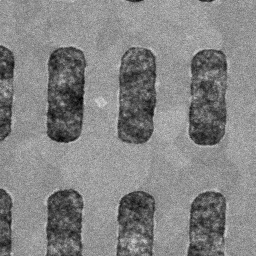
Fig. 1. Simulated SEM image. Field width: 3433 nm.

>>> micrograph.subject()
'holes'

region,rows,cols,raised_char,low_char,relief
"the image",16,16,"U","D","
UUUUUUUUUUUUUUUU
UUUUUUUUUUUUUUUU
UUUUUUUUUUUUUUUU
DUUDDUUUDDUUDDUU
DUUDDUUDDDUUDDUU
DUUDDUUDDDUUDDUU
DUUDDUUDDDUUDDUU
DUUDDUUDDDUUDDUU
UUUDDUUDDUUUDDUU
UUUUUUUUUUUUUUUU
UUUUUUUUUUUUUUUU
UUUUUUUUUUUUUUUU
DUUDDUUUDDUUDDUU
DUUDDUUDDDUUDDUU
DUUDDUUDDDUUDDUU
DUUDDUUDDDUUDDUU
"